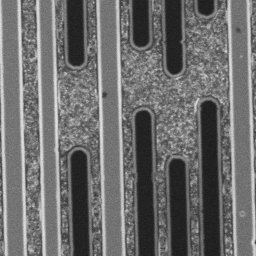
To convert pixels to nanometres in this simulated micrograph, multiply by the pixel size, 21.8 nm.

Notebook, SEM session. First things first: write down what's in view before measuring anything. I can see parallel lines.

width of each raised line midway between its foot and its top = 0.409 micrometres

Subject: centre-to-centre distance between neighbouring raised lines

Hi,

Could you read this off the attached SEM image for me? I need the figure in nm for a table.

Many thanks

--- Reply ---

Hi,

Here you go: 713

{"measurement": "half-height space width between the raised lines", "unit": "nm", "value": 297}